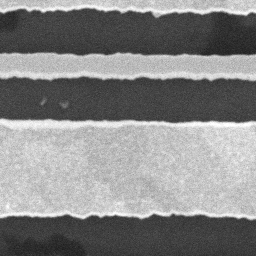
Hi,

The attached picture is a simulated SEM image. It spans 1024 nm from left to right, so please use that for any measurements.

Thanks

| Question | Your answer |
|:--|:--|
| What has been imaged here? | lines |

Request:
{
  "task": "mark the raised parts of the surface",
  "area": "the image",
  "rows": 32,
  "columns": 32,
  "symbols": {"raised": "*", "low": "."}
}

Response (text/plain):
********************************
*................*.****.**..****
................................
................................
................................
................................
................................
********************************
********************************
...............**...............
................................
................................
................................
................................
................................
********************************
********************************
********************************
********************************
********************************
********************************
********************************
********************************
********************************
********************************
********************************
********************************
................................
................................
................................
................................
................................